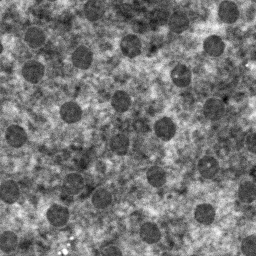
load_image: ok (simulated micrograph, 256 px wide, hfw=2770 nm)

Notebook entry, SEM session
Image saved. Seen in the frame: a regular array of raised bodies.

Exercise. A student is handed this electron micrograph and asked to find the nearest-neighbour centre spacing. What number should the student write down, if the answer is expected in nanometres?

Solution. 494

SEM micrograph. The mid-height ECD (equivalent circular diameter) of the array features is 0.258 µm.